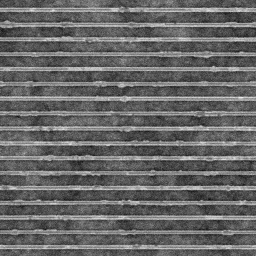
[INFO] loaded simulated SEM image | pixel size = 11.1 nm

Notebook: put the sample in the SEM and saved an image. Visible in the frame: parallel lines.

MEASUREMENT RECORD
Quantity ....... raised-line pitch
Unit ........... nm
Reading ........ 165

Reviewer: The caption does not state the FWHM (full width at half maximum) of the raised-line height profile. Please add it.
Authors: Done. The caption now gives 3.37 px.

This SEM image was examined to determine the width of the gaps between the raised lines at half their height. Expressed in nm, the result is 132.